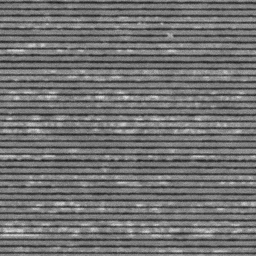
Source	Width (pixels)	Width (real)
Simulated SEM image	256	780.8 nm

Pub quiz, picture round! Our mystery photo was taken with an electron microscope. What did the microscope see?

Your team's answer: parallel lines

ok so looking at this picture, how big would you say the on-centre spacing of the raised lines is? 20.1 nm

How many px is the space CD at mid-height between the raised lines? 2.89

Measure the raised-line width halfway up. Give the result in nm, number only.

11.8